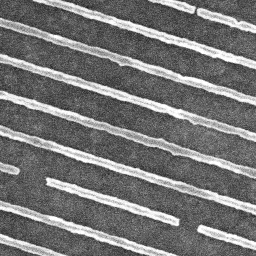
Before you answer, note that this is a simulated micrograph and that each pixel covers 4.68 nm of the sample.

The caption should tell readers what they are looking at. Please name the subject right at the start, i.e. parallel lines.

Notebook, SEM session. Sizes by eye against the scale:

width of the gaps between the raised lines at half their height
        0.126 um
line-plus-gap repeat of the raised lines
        162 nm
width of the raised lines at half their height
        35.1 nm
